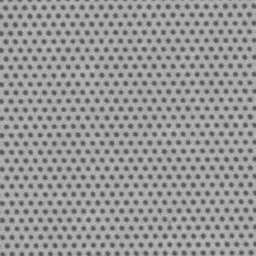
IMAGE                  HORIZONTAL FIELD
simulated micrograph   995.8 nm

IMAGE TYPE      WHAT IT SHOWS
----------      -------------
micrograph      a regular array of holes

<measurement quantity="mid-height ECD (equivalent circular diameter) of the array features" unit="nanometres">19.6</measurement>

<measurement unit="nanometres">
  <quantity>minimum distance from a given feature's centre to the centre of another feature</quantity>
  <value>35.8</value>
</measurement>